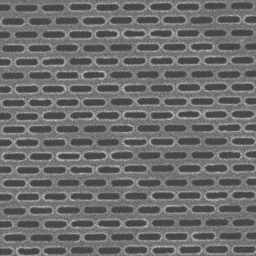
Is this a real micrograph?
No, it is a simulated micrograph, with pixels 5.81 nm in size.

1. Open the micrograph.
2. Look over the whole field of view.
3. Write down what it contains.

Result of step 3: a regular array of holes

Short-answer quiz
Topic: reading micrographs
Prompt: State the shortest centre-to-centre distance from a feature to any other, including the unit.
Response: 108 nanometers